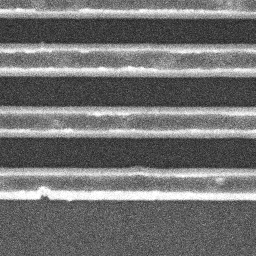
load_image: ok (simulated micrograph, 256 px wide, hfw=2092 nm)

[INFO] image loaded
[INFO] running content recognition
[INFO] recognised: one or a few lines or trenches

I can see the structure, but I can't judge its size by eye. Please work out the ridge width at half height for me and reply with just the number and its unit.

202 nanometres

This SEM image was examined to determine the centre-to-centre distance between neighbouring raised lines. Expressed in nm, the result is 505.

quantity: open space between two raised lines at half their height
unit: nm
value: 300